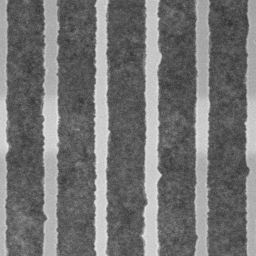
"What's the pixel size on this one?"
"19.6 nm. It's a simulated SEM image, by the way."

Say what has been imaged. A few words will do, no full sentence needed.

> parallel lines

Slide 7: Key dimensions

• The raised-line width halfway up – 225 nm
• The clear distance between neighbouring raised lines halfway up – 0.761 µm